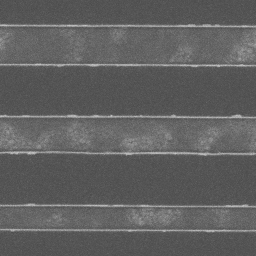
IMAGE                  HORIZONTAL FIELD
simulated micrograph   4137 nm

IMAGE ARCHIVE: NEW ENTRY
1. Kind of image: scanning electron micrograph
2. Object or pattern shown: one or a few lines or trenches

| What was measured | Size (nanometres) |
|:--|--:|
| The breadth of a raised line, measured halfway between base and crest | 852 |